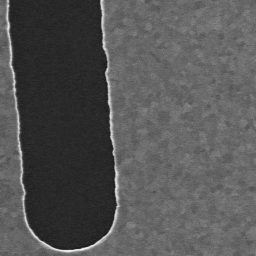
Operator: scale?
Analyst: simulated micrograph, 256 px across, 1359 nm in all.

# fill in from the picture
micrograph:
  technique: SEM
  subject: one or a few lines or trenches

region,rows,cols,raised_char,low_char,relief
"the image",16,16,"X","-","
------XXXXXXXXXX
X-----XXXXXXXXXX
X-----XXXXXXXXXX
X------XXXXXXXXX
X------XXXXXXXXX
X------XXXXXXXXX
X------XXXXXXXXX
X------XXXXXXXXX
X------XXXXXXXXX
X------XXXXXXXXX
X------XXXXXXXXX
X------XXXXXXXXX
X------XXXXXXXXX
XX-----XXXXXXXXX
XX-----XXXXXXXXX
XXX--XXXXXXXXXXX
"